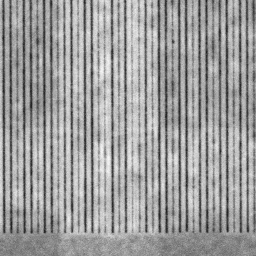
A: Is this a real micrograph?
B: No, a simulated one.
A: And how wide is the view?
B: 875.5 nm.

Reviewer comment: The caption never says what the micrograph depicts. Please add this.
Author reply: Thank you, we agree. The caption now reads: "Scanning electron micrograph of parallel lines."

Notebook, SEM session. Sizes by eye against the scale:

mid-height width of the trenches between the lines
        6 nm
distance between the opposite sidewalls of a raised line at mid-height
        5.23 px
